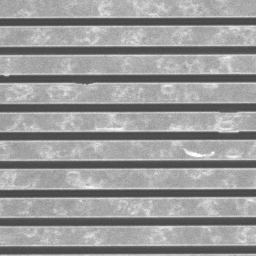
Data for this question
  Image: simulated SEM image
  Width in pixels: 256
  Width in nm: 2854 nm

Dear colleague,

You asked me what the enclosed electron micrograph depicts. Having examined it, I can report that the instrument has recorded parallel lines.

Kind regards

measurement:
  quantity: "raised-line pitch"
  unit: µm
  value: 0.318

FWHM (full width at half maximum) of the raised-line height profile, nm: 233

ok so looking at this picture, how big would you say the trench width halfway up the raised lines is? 83.6 nm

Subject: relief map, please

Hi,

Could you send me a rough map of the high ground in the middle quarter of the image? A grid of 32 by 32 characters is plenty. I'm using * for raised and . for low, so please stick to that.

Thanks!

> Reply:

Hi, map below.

********************************
********************************
********************************
................................
................................
********************************
********************************
********************************
********************************
********************************
................................
................................
********************************
********************************
********************************
********************************
********************************
................................
................................
********************************
********************************
********************************
********************************
********************************
................................
................................
********************************
********************************
********************************
********************************
********************************
................................